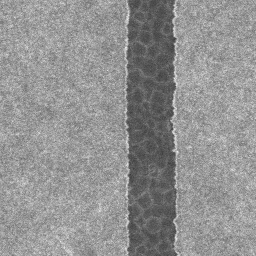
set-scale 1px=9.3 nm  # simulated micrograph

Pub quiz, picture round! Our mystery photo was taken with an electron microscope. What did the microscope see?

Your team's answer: one or a few lines or trenches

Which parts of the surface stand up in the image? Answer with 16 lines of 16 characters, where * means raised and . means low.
********...*****
********...*****
********...*****
********...*****
********...*****
********...*****
********...*****
********...*****
********...*****
********...*****
********...*****
********...*****
********...*****
********...*****
********...*****
********...*****